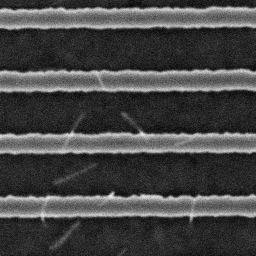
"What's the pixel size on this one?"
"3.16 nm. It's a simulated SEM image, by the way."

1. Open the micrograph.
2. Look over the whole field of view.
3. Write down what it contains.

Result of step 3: lines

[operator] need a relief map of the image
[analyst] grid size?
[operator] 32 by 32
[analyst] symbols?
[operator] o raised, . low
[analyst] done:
................................
oooooooooooooooooooooooooooooooo
oooooooooooooooooooooooooooooooo
ooo..oo.....o...................
................................
................................
................................
................................
................................
oooooooooooooooooooooooooooooooo
oooooooooooooooooooooooooooooooo
................................
................................
................................
................................
................................
................................
oooooooooooooooooooooooooooooooo
oooooooooooooooooooooooooooooooo
................................
................................
................................
................................
................................
.............o..o.oo......o.o..o
oooooooooooooooooooooooooooooooo
oooooooooooooooooooooooooooooooo
................................
................................
................................
................................
................................